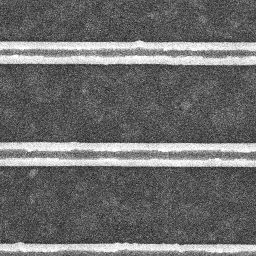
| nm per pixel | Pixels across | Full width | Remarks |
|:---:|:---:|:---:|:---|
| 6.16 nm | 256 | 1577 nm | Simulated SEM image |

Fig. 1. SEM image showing one or a few lines or trenches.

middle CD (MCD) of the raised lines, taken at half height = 108 nm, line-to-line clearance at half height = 517 nanometres